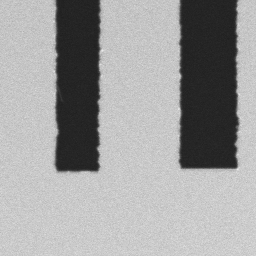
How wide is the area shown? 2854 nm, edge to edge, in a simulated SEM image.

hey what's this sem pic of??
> one or a few lines or trenches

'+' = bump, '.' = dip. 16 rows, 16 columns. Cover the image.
...+++.....++++.
...+++.....++++.
...+++.....++++.
...+++.....++++.
...+++.....++++.
...+++.....++++.
...+++.....++++.
...+++.....++++.
....++.....++++.
...+++.....++++.
....++.....++++.
................
................
................
................
................